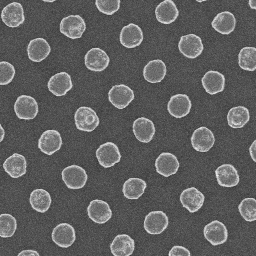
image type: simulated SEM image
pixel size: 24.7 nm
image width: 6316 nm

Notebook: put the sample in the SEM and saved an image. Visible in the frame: a regular array of raised bodies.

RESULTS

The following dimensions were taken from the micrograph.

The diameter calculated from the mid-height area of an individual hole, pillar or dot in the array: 566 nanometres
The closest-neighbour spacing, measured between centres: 41.1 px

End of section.